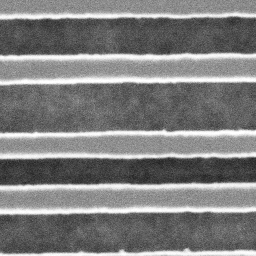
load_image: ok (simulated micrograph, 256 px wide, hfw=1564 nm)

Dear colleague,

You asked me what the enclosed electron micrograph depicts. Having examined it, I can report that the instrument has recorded lines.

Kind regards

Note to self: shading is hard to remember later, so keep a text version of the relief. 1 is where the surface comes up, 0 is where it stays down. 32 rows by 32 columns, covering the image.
11111111111111111111111111111111
11111111111111111111111111111111
00000000000000000000000000000000
00000000000000000000000000000000
00000000000000000000000000000000
00000000000000000000000000000000
00000000000000000000000000000000
11111111111111111111111111111111
11111111111111111111111111111111
11111111111111111111111111111111
11000000000000000000000000000000
00000000000000000000000000000000
00000000000000000000000000000000
00000000000000000000000000000000
00000000000000000000000000000000
00000000000000000000000000000000
00000000000000111111111111111111
11111111111111111111111111111111
11111111111111111111111111111111
11111111111111111111111111111111
00000000000000000000000000000000
00000000000000000000000000000000
00000000000000000000000000000000
11111111111111111111111111111111
11111111111111111111111111111111
11111111111111111111111111111111
11111111111101010000000000000000
00000000000000000000000000000000
00000000000000000000000000000000
00000000000000000000000000000000
00000000000000000000000000000000
00000000000000000001111001111111